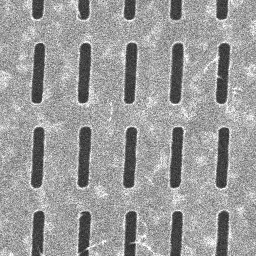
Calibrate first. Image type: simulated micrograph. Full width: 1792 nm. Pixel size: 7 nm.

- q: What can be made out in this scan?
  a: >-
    a regular array of holes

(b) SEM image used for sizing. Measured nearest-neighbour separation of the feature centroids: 323 nm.